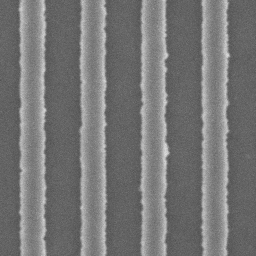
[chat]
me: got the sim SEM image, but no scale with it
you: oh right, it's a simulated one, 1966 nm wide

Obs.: lines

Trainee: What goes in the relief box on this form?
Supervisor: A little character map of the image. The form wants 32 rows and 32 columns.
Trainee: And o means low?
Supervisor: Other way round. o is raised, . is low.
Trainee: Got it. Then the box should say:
...oo.....ooo.....ooo....ooo....
...ooo....ooo.....ooo....ooo....
...ooo....ooo.....ooo....ooo....
...ooo....ooo.....ooo....ooo....
...ooo....ooo.....ooo....ooo....
...ooo....ooo.....ooo....ooo....
...ooo....ooo.....ooo....ooo....
...ooo....ooo.....ooo....ooo....
...ooo....ooo.....ooo....ooo....
...oo.....ooo.....ooo....ooo....
...oo.....ooo.....ooo....ooo....
...oo.....ooo.....ooo....ooo....
...oo.....ooo.....ooo....ooo....
...ooo....ooo.....ooo....ooo....
...ooo....ooo.....oo.....ooo....
...oo.....ooo.....ooo.....oo....
...ooo....ooo.....ooo....ooo....
...ooo....ooo.....ooo....ooo....
...oo.....ooo.....ooo....ooo....
...ooo....ooo.....ooo....ooo....
...oo.....ooo.....ooo....ooo....
...ooo....ooo.....ooo....ooo....
...ooo....ooo.....ooo....ooo....
...ooo....ooo.....ooo....ooo....
...ooo....ooo.....ooo....ooo....
...ooo....ooo.....ooo....ooo....
...oo.....ooo.....ooo....ooo....
...ooo....ooo.....ooo....ooo....
...ooo....ooo.....ooo....ooo....
...oo.....ooo.....ooo....ooo....
...ooo....ooo.....ooo....ooo....
...ooo....ooo.....ooo.....oo....